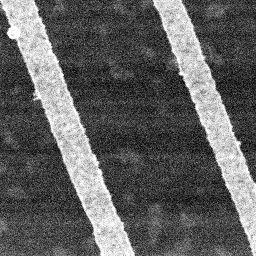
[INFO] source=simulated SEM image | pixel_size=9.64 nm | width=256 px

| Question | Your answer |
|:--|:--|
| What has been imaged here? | one or a few lines or trenches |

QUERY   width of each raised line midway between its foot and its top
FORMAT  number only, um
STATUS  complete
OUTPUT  0.26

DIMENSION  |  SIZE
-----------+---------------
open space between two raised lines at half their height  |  1.09 um